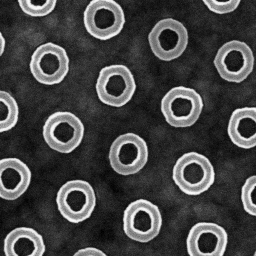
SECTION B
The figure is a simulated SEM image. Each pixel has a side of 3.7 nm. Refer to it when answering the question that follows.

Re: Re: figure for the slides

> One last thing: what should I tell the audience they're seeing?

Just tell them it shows a regular array of ring-shaped raised bodies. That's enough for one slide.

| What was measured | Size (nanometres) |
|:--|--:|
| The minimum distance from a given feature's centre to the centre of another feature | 253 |